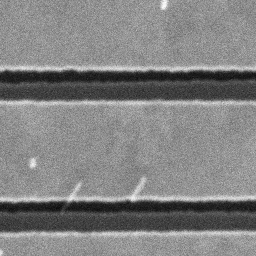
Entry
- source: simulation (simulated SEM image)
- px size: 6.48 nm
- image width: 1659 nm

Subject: lines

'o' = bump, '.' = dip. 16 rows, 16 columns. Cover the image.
oooooooooooooooo
oooooooooooooooo
oooooooooooooooo
oooooooooooooooo
................
................
oooooooooooooooo
oooooooooooooooo
oooooooooooooooo
oooooooooooooooo
oooooooooooooooo
oooooooooooooooo
oooooooo....o...
................
................
oooooooooooooooo